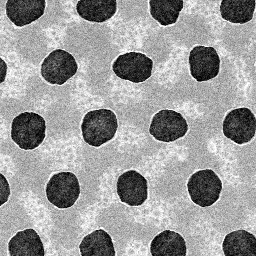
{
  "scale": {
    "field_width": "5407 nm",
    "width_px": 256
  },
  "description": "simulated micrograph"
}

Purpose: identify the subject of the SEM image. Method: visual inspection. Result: a regular array of holes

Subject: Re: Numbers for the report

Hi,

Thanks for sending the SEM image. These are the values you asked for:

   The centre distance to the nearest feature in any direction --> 1460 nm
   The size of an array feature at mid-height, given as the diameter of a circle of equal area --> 749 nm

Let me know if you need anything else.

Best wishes